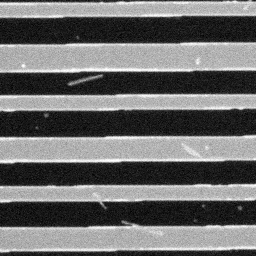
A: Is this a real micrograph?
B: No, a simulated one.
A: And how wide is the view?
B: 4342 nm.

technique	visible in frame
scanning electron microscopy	lines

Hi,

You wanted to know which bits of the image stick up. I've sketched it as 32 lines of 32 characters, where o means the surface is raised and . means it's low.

oooooooooooooooooooooooooooooooo
oooooooooooooooooooooooooooooooo
................................
................................
................................
......................oooooooooo
oooooooooooooooooooooooooooooooo
oooooooooooooooooooooooooooooooo
oooooooooooooooooooooooooooooooo
................................
................................
................................
oooooooooooooooooooooooooooooooo
ooooooooooooooooooooooooooooo.o.
................................
................................
................................
oooooooooooooooooooooooooooooooo
oooooooooooooooooooooooooooooooo
oooooooooooooooooooooooooooooooo
................................
................................
................................
oooooooooooooooooooooooooooooooo
oooooooooooooooooooooooooooooooo
................................
................................
................................
...........ooooooooooooooooooooo
oooooooooooooooooooooooooooooooo
oooooooooooooooooooooooooooooooo
................................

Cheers